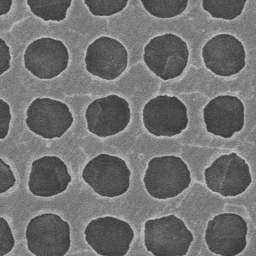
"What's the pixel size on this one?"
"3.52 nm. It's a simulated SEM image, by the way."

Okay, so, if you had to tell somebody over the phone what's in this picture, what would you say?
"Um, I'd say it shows a regular array of holes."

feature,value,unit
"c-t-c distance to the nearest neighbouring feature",207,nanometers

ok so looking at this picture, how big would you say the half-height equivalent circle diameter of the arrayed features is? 155 nanometres